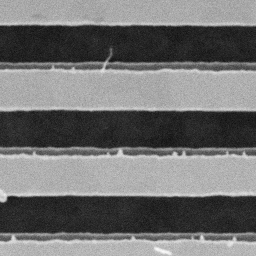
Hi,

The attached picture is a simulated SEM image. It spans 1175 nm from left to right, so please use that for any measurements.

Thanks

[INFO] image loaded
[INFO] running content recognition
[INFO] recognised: lines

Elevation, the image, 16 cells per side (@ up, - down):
@@@@@@@@@@@@@@@@
@@@@@@@@@@@@@@@@
----------------
----------------
@@@@@@@@@@@@@@@@
@@@@@@@@@@@@@@@@
@@@@@@@@@@@@@@@@
----------------
----------------
@@@@@@@@@@@@@@@@
@@@@@@@@@@@@@@@@
@@@@@@@@@@@@@@@@
----------------
----------------
----------------
@@@@@@@@@@@@@@@@